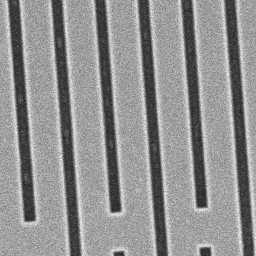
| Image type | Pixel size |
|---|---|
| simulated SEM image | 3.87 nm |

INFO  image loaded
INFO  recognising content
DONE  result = parallel lines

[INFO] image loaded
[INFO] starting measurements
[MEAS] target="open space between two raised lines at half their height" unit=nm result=42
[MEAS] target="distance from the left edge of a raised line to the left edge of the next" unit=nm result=167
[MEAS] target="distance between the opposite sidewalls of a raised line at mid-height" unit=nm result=126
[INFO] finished